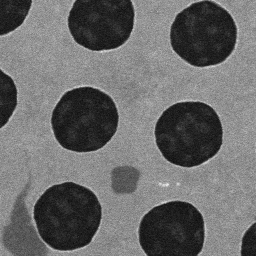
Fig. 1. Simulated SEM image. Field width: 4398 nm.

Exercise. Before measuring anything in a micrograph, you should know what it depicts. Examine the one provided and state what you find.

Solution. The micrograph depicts holes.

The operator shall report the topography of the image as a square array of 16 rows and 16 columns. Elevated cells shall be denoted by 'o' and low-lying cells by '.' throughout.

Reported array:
..oo....oooo..oo
.ooo....ooo....o
ooooo...ooo....o
ooooooooooo...oo
oooooooooooooooo
.oooo.oooooooooo
.ooo...oooo..ooo
.oo....ooo....oo
ooo....ooo....oo
ooooo.oooo....oo
oooooooooooooooo
oooo.ooooooooooo
oo....oooooooooo
oo....ooo....ooo
oo....ooo....oo.
ooo..oooo....oo.